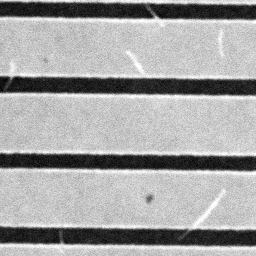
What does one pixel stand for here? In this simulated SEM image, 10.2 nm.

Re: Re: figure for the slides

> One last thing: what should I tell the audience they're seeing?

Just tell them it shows lines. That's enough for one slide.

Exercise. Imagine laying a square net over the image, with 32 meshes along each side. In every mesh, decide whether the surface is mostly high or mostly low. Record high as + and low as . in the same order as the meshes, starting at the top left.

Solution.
.............................+.+
................................
++++++++++++++++++++++++++++++..
++++++++++++++++++++++++++++++++
++++++++++++++++++++++++++++++++
++++++++++++++++++++++++++++++++
++++++++++++++++++++++++++++++++
++++++++++++++++++++++++++++++++
++++++++++++++++++++++++++++++++
.+++++++++++++++++++++++++++++++
................................
................................
++++++++++++++++++++++++++++++++
++++++++++++++++++++++++++++++++
++++++++++++++++++++++++++++++++
++++++++++++++++++++++++++++++++
++++++++++++++++++++++++++++++++
++++++++++++++++++++++++++++++++
++++++++++++++++++++++++++++++++
................................
................................
++++++++++++++++++++++++++++++..
++++++++++++++++++++++++++++++++
++++++++++++++++++++++++++++++++
++++++++++++++++++++++++++++++++
++++++++++++++++++++++++++++++++
++++++++++++++++++++++++++++++++
++++++++++++++++++++++++++++++++
...................+.+++++++++++
................................
................................
++++++++++++++++++++++++++++++++